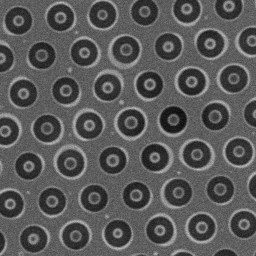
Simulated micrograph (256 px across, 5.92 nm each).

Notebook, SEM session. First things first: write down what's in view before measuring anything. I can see an array of small figures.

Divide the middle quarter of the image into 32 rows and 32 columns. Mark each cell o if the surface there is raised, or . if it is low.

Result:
oooo...oooooooo.oooooooooooooooo
ooooooooooooooooooooooooooooo...
ooooooooo....oooooo.....ooooo...
..oooooo......oooo......oooo...o
...ooooo......oooo..oo...ooo...o
o...ooo...oo...ooo..ooo..ooo....
oo..ooo...oo..oooo.......oooo...
o...oooo......ooooo.....oooooo..
....oooo.....ooooooo...ooooooooo
...ooooooooooooooooooooooooooooo
oooooooooooooooooooooooooo..oooo
ooooo.ooooooooo....oooooo.....oo
oooo....oooooo......oooo.......o
ooo......oooo...oo..oooo..ooo..o
ooo...o...ooo..ooo..oooo..ooo..o
oo...oo...ooo...oo..oooo.......o
ooo.......ooo.......oooo......oo
ooo......ooooo.....ooooooo...ooo
oooo....oooooooo..oooooooooooooo
ooooooooooooooooooooooooooooooo.
ooooooooooooooooooooo....ooooo..
....oooooo.....ooooo......ooo...
.....oooo.......ooo...o....oo...
.....oooo..oo...ooo...oo...oo...
ooo..oooo..oo...ooo........ooo..
ooo..oooo......ooooo......ooooo.
.....ooooo.....oooooo....ooooooo
....ooooooo..ooooooooooooooooooo
o..ooooooooooooooooooooooooooooo
ooooooooooooooooo..ooooooo.....o
oooooo...ooooooo.....oooo.......
ooooo.....ooooo......oooo...oo..